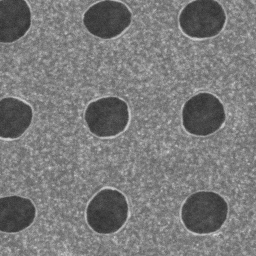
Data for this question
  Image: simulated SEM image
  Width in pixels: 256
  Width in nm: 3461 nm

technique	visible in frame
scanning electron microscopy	holes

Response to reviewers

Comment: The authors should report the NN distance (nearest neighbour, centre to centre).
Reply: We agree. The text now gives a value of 95.2 px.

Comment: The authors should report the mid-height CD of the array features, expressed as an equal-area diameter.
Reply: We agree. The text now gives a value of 0.596 micrometres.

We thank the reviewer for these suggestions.